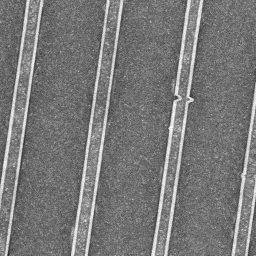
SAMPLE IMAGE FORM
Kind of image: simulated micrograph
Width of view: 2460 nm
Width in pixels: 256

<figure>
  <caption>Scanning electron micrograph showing one or a few lines or trenches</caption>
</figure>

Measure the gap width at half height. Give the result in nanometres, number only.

626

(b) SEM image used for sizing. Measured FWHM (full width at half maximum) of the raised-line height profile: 0.139 microns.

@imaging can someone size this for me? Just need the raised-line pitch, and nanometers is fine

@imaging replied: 763